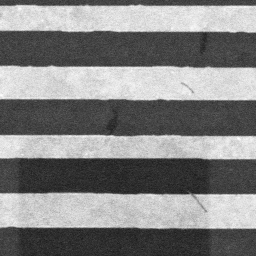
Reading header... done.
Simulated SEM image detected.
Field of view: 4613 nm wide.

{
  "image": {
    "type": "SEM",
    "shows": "lines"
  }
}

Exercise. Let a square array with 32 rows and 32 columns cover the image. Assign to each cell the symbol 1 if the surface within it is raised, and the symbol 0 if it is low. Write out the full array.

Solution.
00000000000000000000000000000000
11111111111111111111111111111111
11111111111111111111111111111111
11111111111111111111111111111111
00000000000000000000000000000000
00000000000000000000000000000000
00000000000000000000000000000000
00000000000000000000000000000000
11111111111111111111110000000000
11111111111111111111111111111111
11111111111111111111111111111111
11111111111111111111111111111111
00000000000000000000000000000000
00000000000000000000000000000000
00000000000000000000000000000000
00000000000000000000000000000000
00000000000000000000000000000000
11111111111111111111111111111111
11111111111111111111111111111111
11111111111111111111111111111111
00000000000000000000000000000000
00000000000000000000000000000000
00000000000000000000000000000000
00000000000000000000000000000000
11111111111111111111111111111111
11111111111111111111111111111111
11111111111111111111111111111111
11111111111111111111111111111111
00000000000000000000000000000000
00000000000000000000000000000000
00000000000000000000000000000000
00000000000000000000000000000000